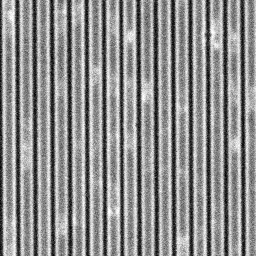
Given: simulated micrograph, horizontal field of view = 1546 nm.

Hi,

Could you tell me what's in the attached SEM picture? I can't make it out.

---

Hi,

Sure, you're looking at parallel lines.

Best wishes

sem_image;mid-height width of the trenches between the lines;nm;36.2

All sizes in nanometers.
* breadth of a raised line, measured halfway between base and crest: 71.7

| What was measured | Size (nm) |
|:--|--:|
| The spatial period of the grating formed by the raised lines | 105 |